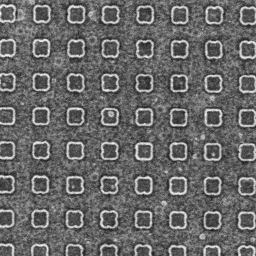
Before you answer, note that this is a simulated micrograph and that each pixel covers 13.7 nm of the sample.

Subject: a regular array of raised bodies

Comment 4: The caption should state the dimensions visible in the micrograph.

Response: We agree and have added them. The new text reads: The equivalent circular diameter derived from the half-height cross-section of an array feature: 239 nm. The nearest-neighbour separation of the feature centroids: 464 nanometres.